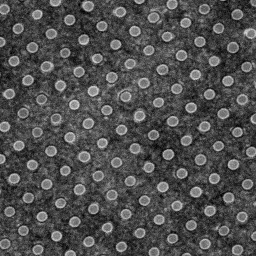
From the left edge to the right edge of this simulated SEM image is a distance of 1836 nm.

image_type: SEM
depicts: a regular array of raised bodies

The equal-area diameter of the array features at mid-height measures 9.9 pixels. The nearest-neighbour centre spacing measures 0.163 um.